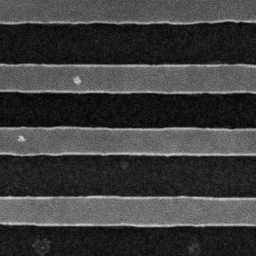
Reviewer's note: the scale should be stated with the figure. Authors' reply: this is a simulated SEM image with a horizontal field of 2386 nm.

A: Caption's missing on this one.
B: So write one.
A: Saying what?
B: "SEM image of lines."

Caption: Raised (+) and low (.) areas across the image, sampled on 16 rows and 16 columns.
++++++++++++++++
................
................
................
++++++++++++++++
++++++++++++++++
................
................
++++++++++++++++
++++++++++++++++
................
................
++++++++++++++++
++++++++++++++++
................
................